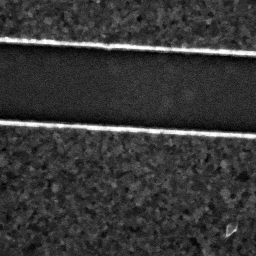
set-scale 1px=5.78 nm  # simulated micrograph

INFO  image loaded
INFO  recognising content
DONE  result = one or a few lines or trenches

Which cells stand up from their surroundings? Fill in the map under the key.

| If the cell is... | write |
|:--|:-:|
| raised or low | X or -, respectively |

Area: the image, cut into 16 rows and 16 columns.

XXXXXXXXXXXXXXXX
XXXXXXXXXXXXXXXX
XXXXXXXXXXXXXXXX
----------------
----------------
----------------
----------------
----------------
XXXXXXXXXXXXXXXX
XXXXXXXXXXXXXXXX
XXXXXXXXXXXXXXXX
XXXXXXXXXXXXXXXX
XXXXXXXXXXXXXXXX
XXXXXXXXXXXXXXXX
XXXXXXXXXXXXXXXX
XXXXXXXXXXXXXXXX